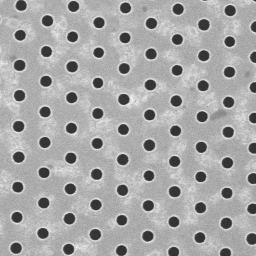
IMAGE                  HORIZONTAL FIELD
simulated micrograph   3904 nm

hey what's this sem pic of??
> a regular array of holes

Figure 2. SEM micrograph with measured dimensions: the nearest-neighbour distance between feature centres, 455 nm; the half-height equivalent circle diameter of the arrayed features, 167 nm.